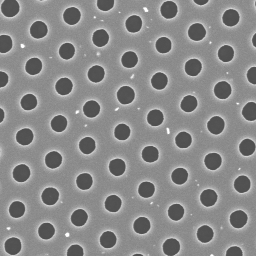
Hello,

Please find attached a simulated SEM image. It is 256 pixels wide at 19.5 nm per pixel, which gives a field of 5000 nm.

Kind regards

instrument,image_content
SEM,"a regular array of holes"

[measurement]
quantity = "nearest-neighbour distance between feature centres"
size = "0.695 µm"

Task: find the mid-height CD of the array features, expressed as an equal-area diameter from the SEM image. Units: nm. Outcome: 336